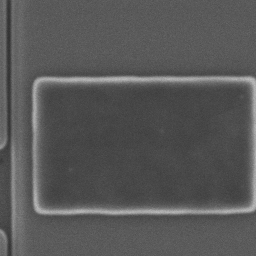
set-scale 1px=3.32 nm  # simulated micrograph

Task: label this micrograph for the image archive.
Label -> wiring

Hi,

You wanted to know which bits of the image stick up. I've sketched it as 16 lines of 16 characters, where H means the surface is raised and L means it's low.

LLLLLLLLLLLLLLLL
LLLLLLLLLLLLLLLL
LLLLLLLLLLLLLLLL
LLLLLLLLLLLLLLLL
LLLLLLLLLLLLLLLL
LLHHHHHHHHHHHHHH
LLHHHHHHHHHHHHHH
LLHHHHHHHHHHHHHH
LLHHHHHHHHHHHHHH
LLHHHHHHHHHHHHHH
LLHHHHHHHHHHHHHH
LLHHHHHHHHHHHHHH
LLHHHHHHHHHHHHHH
LLLLLLLLLLLLLLLL
LLLLLLLLLLLLLLLL
LLLLLLLLLLLLLLLL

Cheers